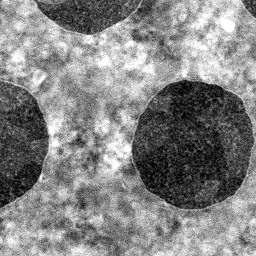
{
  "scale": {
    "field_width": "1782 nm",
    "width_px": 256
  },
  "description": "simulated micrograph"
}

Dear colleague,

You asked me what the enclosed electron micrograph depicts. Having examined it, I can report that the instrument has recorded raised bodies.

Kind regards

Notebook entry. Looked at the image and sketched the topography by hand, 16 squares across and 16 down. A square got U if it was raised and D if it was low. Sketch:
DDUUUUUUUDDDDDDU
DDDUUUUDDDDDDDDD
DDDDDDDDDDDDDDDD
DDDDDDDDDDDDDDDD
DDDDDDDDDDDDDDDD
UDDDDDDDDDUUUUDD
UUDDDDDDDUUUUUUD
UUUDDDDDDUUUUUUU
UUUDDDDDUUUUUUUU
UUUDDDDDUUUUUUUU
UUUDDDDDUUUUUUUU
UUDDDDDDDUUUUUUD
UDDDDDDDDDUUUUDD
DDDDDDDDDDDDDDDD
DDDDDDDDDDDDDDDD
DDDDDDDDDDDDDDDD